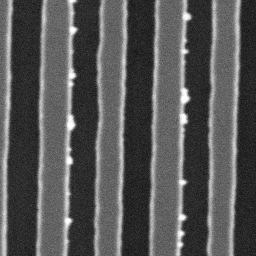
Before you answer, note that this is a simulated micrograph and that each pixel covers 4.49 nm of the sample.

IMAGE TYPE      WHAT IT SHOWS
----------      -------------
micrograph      lines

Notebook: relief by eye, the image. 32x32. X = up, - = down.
X----XXXX----XXX----XXX----XXX--
X----XXXX----XXX----XXX----XXX--
X----XXXX----XXX----XXX----XXX--
X----XXXX----XXX----XXX----XXX--
X----XXXX----XXX---XXXX----XXX--
X----XXXX---XXXX---XXXX----XXX--
X----XXXX---XXXX---XXXX----XXX--
X----XXXX---XXXX---XXXX---XXXX--
X----XXXX---XXXX---XXXX---XXXX--
X----XXXX---XXXX---XXXX---XXXX--
X----XXXX---XXX----XXXX---XXXX--
X----XXXX---XXX----XXXX---XXXX--
X----XXXX---XXX----XXXX---XXXX--
X----XXXX---XXX----XXXX---XXXX--
X----XXXX---XXX----XXXX---XXXX--
X----XXXX---XXX----XXXX---XXX---
X----XXXX---XXX----XXXX---XXX---
X----XXXX---XXX----XXXX---XXX---
X----XXXX---XXX----XXXX---XXX---
X----XXXX---XXX----XXXX---XXX---
X----XXXX---XXX----XXXX---XXX---
X----XXX----XXX----XXXX---XXX---
X----XXX----XXX----XXXX---XXX---
X----XXX----XXX----XXXX---XXX---
X----XXX----XXX----XXXX---XXX---
X----XXX----XXX----XXXX---XXX---
X----XXX----XXX----XXXX---XXX---
X----XXXX---XXX----XXXX---XXX---
X----XXX----XXX----XXXX---XXX---
X----XXX----XXX----XXXX---XXX---
X----XXX----XXX----XXXX---XXX---
X----XXX----XXX----XXX----XXX---